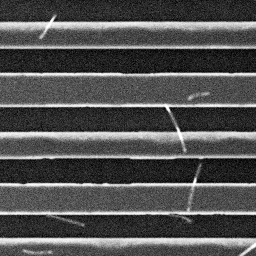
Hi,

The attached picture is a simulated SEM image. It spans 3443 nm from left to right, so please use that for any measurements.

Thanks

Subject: lines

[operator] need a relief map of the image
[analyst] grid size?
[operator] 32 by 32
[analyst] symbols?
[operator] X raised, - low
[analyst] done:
--------------------------------
--------------------------------
--------------------------------
XXXXXXXXXXXXXXXXXXXXXXXXXXXXXXXX
XXXXXXXXXXXXXXXXXXXXXXXXXXXXXXXX
XXXXXXXXXXXXXXXXXXXXXXXXXXXXXXXX
--------------------------------
--------------------------------
--------------------------------
XXXXXXXXXXXXXXXXXXXXXXXXXXXXXXXX
XXXXXXXXXXXXXXXXXXXXXXXXXXXXXXXX
XXXXXXXXXXXXXXXXXXXXXXXXXXXXXXXX
XXXXXXXXXXXXXXXXXXXXXXXXXXXXXXXX
--------------------------------
--------------------------------
--------------------------------
--------------------------------
XXXXXXXXXXXXXXXXXXXXXXXXXXXXXXXX
XXXXXXXXXXXXXXXXXXXXXXXXXXXXXXXX
XXXXXXXXXXXXXXXXXXXXXXXXXXXXXXXX
--------------------------------
--------------------------------
--------------------------------
XXXXXXXXXXXXXXXXXXXXXXXXXXXXXXXX
XXXXXXXXXXXXXXXXXXXXXXXXXXXXXXXX
XXXXXXXXXXXXXXXXXXXXXXXXXXXXXXXX
XXXXXXXXXXXXXXXXXXXXXXXXXXXXXXXX
--------------------------------
--------------------------------
--------------------------------
XXXXXXXXXXXXXXXXXXXXXXXXXXXXXXXX
XXXXXXXXXXXXXXXXXXXXXXXXXXXXXXXX